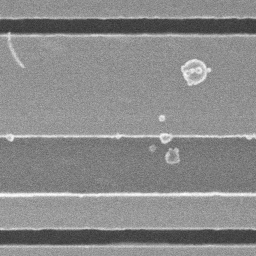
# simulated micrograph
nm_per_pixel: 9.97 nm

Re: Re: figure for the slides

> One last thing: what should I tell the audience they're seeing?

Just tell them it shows lines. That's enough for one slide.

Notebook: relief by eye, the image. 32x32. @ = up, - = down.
@@@@@@@@@@@@@@@@@@@@@@@@@@@@@@@@
@@@@@@@@@@@@@@@@@@@@@@@@@@@@@@@@
--------------------------------
--------------------------------
@@@@@@@@@@@@@@@@@@@@@@@@@@@@@@@@
@@@@@@@@@@@@@@@@@@@@@@@@@@@@@@@@
@@@@@@@@@@@@@@@@@@@@@@@@@@@@@@@@
@@@@@@@@@@@@@@@@@@@@@@@@@@@@@@@@
@@@@@@@@@@@@@@@@@@@@@@@@@@@@@@@@
@@@@@@@@@@@@@@@@@@@@@@@@@@@@@@@@
@@@@@@@@@@@@@@@@@@@@@@@@@@@@@@@@
@@@@@@@@@@@@@@@@@@@@@@@@@@@@@@@@
@@@@@@@@@@@@@@@@@@@@@@@@@@@@@@@@
@@@@@@@@@@@@@@@@@@@@@@@@@@@@@@@@
@@@@@@@@@@@@@@@@@@@@@@@@@@@@@@@@
@@@@@@@@@@@@@@@@@@@@@@@@@@@@@@@@
@@@@@@@@@@@@@@@@@@@@@@@@@@@@@@@@
--------------------@-----------
--------------------------------
--------------------------------
--------------------------------
--------------------------------
--------------------------------
--------------------------------
@@@@@@@@@@@@@@@@@@@@@@@@@@@@@@@@
@@@@@@@@@@@@@@@@@@@@@@@@@@@@@@@@
@@@@@@@@@@@@@@@@@@@@@@@@@@@@@@@@
@@@@@@@@@@@@@@@@@@@@@@@@@@@@@@@@
@@@@@@@@@@@@@@@@@@@@@@@@@@@@@@@@
--------------------------------
--------------------------------
@@@@@@@@@@@@@@@@@@@@@@@@@@@@@@@@